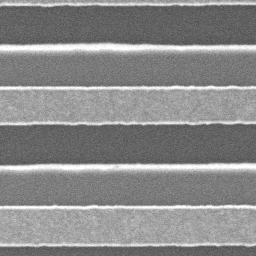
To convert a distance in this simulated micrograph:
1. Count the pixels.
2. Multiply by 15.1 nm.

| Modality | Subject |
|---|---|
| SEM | lines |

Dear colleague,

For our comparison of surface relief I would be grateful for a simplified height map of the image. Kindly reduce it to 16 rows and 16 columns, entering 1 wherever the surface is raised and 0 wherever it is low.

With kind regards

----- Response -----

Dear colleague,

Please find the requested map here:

0000000000000000
0000000000000000
0000000000000000
1111111111111111
1111111111111111
1111111111111111
1111111111111111
1111111111111111
0000000000000000
0000000000000000
0000000110110111
1111111111111111
1111111111111111
1111111111111111
1111111111111111
0000000000000000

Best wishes